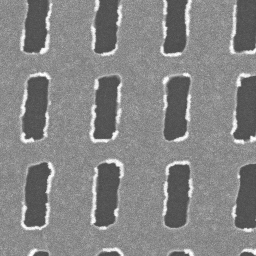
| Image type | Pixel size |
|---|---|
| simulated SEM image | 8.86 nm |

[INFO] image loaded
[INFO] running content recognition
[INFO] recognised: holes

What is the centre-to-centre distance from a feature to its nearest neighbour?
621 nanometers